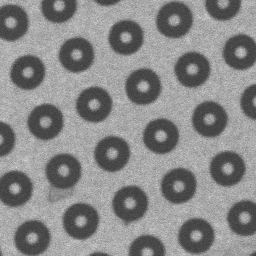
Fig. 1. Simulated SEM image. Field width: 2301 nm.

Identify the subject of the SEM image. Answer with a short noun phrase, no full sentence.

a regular array of ring-shaped grooves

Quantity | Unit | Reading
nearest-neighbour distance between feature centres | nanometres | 464